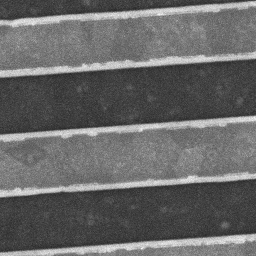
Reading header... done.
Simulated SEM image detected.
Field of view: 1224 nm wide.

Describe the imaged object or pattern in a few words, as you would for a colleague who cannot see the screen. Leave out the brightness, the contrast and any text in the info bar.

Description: one or a few lines or trenches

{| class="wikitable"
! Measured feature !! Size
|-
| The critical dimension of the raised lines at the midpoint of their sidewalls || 0.266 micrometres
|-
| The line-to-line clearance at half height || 289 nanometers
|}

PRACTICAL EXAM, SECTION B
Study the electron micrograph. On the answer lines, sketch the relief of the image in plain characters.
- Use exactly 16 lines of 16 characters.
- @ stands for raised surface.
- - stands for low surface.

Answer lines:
------------@@@@
@@@@@@@@@@@@@@@@
@@@@@@@@@@@@@@@@
@@@@@@@@@@@@@@@@
@@@-------------
----------------
----------------
--------------@@
-@@@@@@@@@@@@@@@
@@@@@@@@@@@@@@@@
@@@@@@@@@@@@@@@@
@@@@@@@@@-------
----------------
----------------
----------------
------@@@@@@@@@@